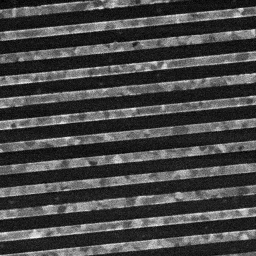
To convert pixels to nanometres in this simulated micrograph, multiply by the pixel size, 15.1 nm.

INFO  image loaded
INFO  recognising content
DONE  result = parallel lines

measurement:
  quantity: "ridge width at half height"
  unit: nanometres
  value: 122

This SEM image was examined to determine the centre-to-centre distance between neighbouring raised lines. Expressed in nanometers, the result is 335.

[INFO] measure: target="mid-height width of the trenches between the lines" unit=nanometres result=216